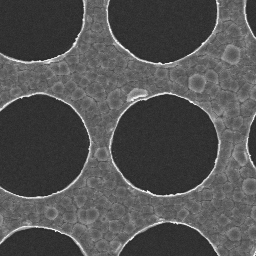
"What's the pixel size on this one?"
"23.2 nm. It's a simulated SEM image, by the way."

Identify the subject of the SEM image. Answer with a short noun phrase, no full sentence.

holes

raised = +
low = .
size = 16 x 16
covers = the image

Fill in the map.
.....++.......+.
.....++......+++
.....++......+++
....++++....++++
++++++++++++++++
++++++++++++++++
+...++++....++++
.....++......+++
......+.......++
......+.......++
.....++......+++
....++++....++++
++++++++++++++++
++++++++++++++++
+...+++++...++++
.....+++.....+++